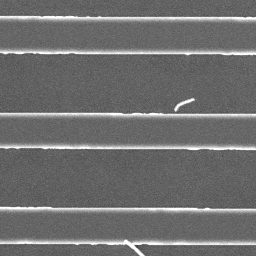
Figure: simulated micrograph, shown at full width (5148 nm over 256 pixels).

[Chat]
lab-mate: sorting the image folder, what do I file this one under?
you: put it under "lines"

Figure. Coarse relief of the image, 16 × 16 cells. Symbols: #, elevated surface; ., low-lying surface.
................
################
################
................
................
................
................
################
################
................
................
................
................
################
################
................